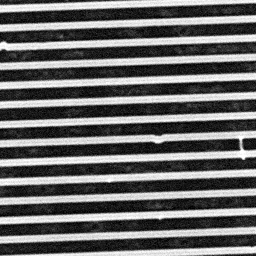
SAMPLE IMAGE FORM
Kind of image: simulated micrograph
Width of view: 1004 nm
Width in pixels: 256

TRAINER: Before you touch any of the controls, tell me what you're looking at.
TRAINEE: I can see parallel lines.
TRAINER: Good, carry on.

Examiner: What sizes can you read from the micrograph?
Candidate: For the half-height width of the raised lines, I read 0.0259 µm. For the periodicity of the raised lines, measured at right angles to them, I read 75.4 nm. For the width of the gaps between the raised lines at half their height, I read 51.9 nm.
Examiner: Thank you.